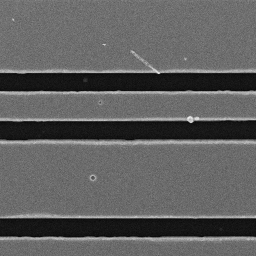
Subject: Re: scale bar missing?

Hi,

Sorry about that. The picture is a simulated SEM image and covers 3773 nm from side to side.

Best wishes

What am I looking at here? lines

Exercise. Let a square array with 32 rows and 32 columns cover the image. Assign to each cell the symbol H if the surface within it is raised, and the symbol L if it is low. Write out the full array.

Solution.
HHHHHHHHHHHHHHHHHHHHHHHHHHHHHHHH
HHHHHHHHHHHHHHHHHHHHHHHHHHHHHHHH
HHHHHHHHHHHHHHHHHHHHHHHHHHHHHHHH
HHHHHHHHHHHHHHHHHHHHHHHHHHHHHHHH
HHHHHHHHHHHHHHHHHHHHHHHHHHHHHHHH
HHHHHHHHHHHHHHHHHHHHHHHHHHHHHHHH
HHHHHHHHHHHHHHHHHHHHHHHHHHHHHHHH
HHHHHHHHHHHHHHHHHHHHHHHHHHHHHHHH
HHHHHHHHHHHHHHHHHHHHHHHHHHHHHHHH
LLLLLLLLLLLLLLLLLLLLLLLLLLLLLLLL
LLLLLLLLLLLLLLLLLLLLLLLLLLLLLLLL
HHHHHHHHHHHHHHHHHHHHHHHHHHHHHHHH
HHHHHHHHHHHHHHHHHHHHHHHHHHHHHHHH
HHHHHHHHHHHHHHHHHHHHHHHHHHHHHHHH
HHHHHHHHHHHHHHHHHHHHHHHHHHHHHHHH
LLLLLLLLLLLLLLLLLLLLLLLLLLLLLLLL
LLLLLLLLLLLLLLLLLLLLLLLLLLLLLLLL
LLLLHHHLHLLLLLLLLLLHLHLLLLLLLLHL
HHHHHHHHHHHHHHHHHHHHHHHHHHHHHHHH
HHHHHHHHHHHHHHHHHHHHHHHHHHHHHHHH
HHHHHHHHHHHHHHHHHHHHHHHHHHHHHHHH
HHHHHHHHHHHHHHHHHHHHHHHHHHHHHHHH
HHHHHHHHHHHHHHHHHHHHHHHHHHHHHHHH
HHHHHHHHHHHHHHHHHHHHHHHHHHHHHHHH
HHHHHHHHHHHHHHHHHHHHHHHHHHHHHHHH
HHHHHHHHHHHHHHHHHHHHHHHHHHHHHHHH
HHHHHHHHHHHHHHHHHHHHHHHHHHHHHHHH
LLLLLLLLLLLLLLLLLLLLLLLLLLLLLLLL
LLLLLLLLLLLLLLLLLLLLLLLLLLLLLLLL
LLLLLLLLLLLLLLLLLLLLLLLLLLLLLLLL
HHHHHHHHHHHHHHHHHHHHHHHHHHHHHHHH
HHHHHHHHHHHHHHHHHHHHHHHHHHHHHHHH